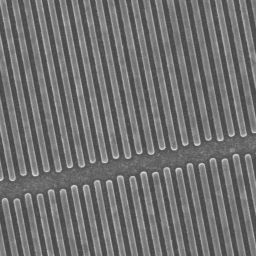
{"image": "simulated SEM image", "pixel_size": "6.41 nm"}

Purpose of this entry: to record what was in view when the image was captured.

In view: parallel lines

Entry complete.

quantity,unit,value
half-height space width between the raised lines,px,5.54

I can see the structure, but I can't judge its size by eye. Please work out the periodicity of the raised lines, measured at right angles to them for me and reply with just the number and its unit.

75.4 nm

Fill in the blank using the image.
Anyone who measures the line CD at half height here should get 0.0402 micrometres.